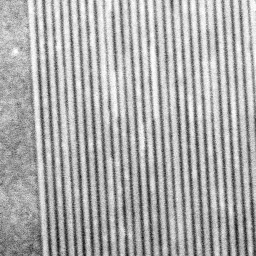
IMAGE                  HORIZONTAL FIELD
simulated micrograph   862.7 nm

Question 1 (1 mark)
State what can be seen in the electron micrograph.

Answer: parallel lines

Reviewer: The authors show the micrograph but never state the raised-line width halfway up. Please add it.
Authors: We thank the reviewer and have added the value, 4.99 px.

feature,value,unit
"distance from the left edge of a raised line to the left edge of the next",28.7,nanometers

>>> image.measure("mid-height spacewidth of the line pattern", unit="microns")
0.0114